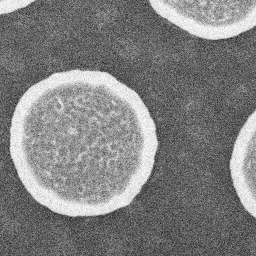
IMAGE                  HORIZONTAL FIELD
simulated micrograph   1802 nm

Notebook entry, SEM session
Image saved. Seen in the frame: raised bodies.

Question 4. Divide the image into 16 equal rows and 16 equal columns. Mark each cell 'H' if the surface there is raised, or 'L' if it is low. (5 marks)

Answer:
LLLLLLLLLLHHHHHH
LLLLLLLLLLLLHHHL
LLLLLLLLLLLLLLLL
LLLLLLLLLLLLLLLL
LLLLLLLLLLLLLLLL
LLLHHHHLLLLLLLLL
LHHHHHHHHLLLLLLL
LHHHHHHHHLLLLLLL
LHHHHHHHHLLLLLLH
LHHHHHHHHLLLLLLH
LHHHHHHHHLLLLLLH
LLHHHHHHHLLLLLLH
LLLHHHHHLLLLLLLH
LLLLLLLLLLLLLLLL
LLLLLLLLLLLLLLLL
LLLLLLLLLLLLLLLL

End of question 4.